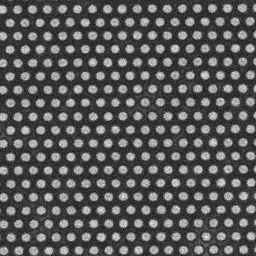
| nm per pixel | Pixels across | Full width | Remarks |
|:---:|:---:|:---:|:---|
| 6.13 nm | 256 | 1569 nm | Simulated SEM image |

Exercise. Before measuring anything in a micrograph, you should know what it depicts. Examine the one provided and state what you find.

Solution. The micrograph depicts a regular array of raised bodies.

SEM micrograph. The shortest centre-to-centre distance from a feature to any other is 91.2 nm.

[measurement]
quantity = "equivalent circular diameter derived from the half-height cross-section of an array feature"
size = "50.3 nm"